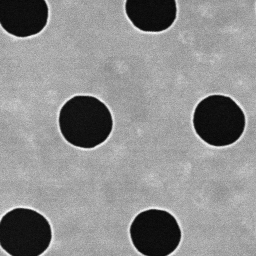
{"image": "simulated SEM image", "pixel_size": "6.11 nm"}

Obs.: holes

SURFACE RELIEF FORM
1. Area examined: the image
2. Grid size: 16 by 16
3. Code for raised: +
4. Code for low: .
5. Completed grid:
...+++++...+++++
...+++++...+++++
++++++++++++++++
++++++++++++++++
++++++++++++++++
++++++++++++++++
++++..++++++...+
++++...+++++...+
++++...+++++...+
++++++++++++++++
++++++++++++++++
++++++++++++++++
++++++++++++++++
...++++++..+++++
...+++++...+++++
...++++++..+++++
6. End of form